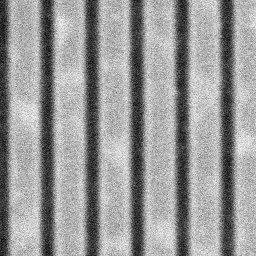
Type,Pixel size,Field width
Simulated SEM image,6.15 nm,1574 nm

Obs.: parallel lines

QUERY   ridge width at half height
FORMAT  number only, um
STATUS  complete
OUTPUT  0.181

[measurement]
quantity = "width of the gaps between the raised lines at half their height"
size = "93.8 nm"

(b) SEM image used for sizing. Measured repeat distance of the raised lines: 277 nm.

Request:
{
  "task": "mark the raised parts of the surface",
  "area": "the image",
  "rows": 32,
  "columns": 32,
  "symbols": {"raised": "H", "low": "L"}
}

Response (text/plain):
LHHHHLLHHHLLLHHHLLHHHHLLHHHLLHHH
LHHHHLLHHHLLLHHHLLHHHHLLHHHLLHHH
LHHHHLLHHHLLLHHHLLHHHHLLHHHLLHHH
LHHHHLLHHHLLLHHHLLHHHHLLHHHLLHHH
LHHHHLLHHHLLLHHHLLHHHHLLHHHLLHHH
LHHHHLLHHHLLLHHHLLHHHHLLHHHLLHHH
LHHHHLLHHHLLHHHHLLHHHHLLHHHLLHHH
LHHHHLLHHHLLLHHHLLHHHHLLHHHLLHHH
LHHHHLLHHHLLLHHHLLHHHHLLHHHLLHHH
LHHHHLLHHHHLLHHHLLHHHHLLHHHLLHHH
LHHHHLLHHHHLLHHHLLHHHHLLHHHLLHHH
LHHHHLLHHHHLLHHHLLHHHHLLHHHLLHHH
LHHHHLLHHHHLLHHHLLHHHHLLHHHLLHHH
LHHHHLLHHHHLLHHHLLHHHHLLHHHLLHHH
LHHHHLLHHHLLLHHHLLHHHHLLHHHLLHHH
LHHHHLLHHHLLLHHHLLHHHHLLHHHLLHHH
LHHHHLLHHHLLLHHHLLHHHHLLHHHLLHHH
LHHHHLLHHHLLLHHHLLHHHHLLHHHLLHHH
LHHHHLLHHHLLLHHHLLHHHHLLHHHLLHHH
LHHHHLLHHHHLLHHHLLHHHHLLHHHLLLHH
LHHHHLLHHHHLLHHHLLHHHHLLHHHLLLHH
LHHHHLLHHHLLLHHHLLHHHHLLHHHLLLHH
LHHHHLLHHHLLLHHHLLHHHHLLHHHLLLHH
LHHHHLLHHHLLLHHHLLHHHHLLHHHLLLHH
LHHHHLLHHHLLLHHHLLHHHHLLHHHLLLHH
LHHHHLLHHHLLLHHHLLHHHHLLHHHLLLHH
LHHHHLLHHHLLLHHHLLHHHHLLHHHLLLHH
LHHHHLLHHHLLLHHHLLHHHHLLHHHLLLHH
LHHHHLLHHHLLLHHHLLHHHHLLHHHLLLHH
LHHHHLLHHHHLLHHHLLHHHHLLHHHLLLHH
LHHHHLLHHHHLLHHHLLHHHHLLHHHLLLHH
LHHHHLLHHHHLLHHHLLHHHHLLHHHLLLHH